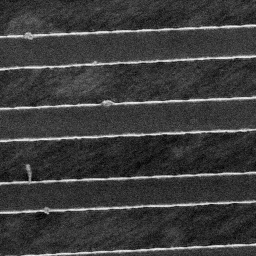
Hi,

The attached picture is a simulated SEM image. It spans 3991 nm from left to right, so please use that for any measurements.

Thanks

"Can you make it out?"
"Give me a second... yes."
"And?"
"lines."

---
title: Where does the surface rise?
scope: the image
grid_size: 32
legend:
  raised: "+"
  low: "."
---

................................
................................
................................
..........................++++++
...+++++++++++++++++++++++++++++
++++++++++++++++++++++++++++++++
++++++++++++++++++++++++++++++++
++++++++++++++++++++++..........
++..............................
................................
................................
................................
...........................+++++
..++++++++++++++++++++++++++++++
++++++++++++++++++++++++++++++++
++++++++++++++++++++++++++++++++
+++++++++++++++++++++++++.......
+++++...........................
................................
................................
................................
................................
...........+++++++++++++++++++++
++++++++++++++++++++++++++++++++
++++++++++++++++++++++++++++++++
++++++++++++++++++++++++++......
++..............................
................................
................................
................................
................................
............++++++++++++++++++++